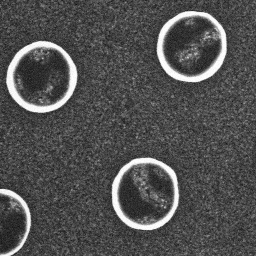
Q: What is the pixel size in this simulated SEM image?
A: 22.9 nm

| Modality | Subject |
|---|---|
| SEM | raised bodies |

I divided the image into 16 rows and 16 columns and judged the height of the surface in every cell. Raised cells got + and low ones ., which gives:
................
...........+++..
..........++++..
.+++......++++..
.++++......++...
.+++............
..++............
................
................
................
........++......
.......++++.....
+......++++.....
++......+++.....
++..............
+...............